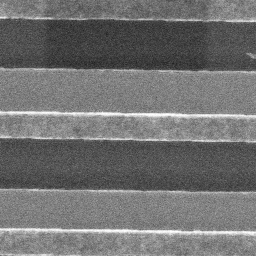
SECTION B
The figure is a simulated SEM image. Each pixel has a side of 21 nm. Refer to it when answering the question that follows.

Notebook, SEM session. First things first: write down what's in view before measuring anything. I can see lines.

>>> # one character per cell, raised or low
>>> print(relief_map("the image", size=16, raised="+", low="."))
++++++++++++++++
................
................
................
++++++++++++++++
++++++++++++++++
++++++++++++++++
++++++++++++++++
++++++++++++++++
................
................
................
++++++++++++++++
++++++++++++++++
++++++++++++++++
++++++++++++++++